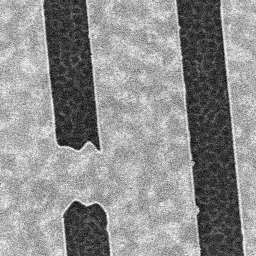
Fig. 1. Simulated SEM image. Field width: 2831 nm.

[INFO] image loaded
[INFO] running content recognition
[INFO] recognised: one or a few lines or trenches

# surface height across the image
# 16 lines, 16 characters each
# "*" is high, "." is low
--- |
***..******...**
***...*****...**
***...*****...**
***...*****...**
***...*****...**
***...*****...**
***...******..**
***...******..**
***...******...*
************...*
************...*
************...*
************...*
****...*****...*
****...*****...*
****...*****...*